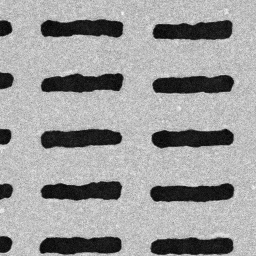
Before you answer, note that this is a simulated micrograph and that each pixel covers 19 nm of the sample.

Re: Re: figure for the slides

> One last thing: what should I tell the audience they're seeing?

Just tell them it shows a regular array of holes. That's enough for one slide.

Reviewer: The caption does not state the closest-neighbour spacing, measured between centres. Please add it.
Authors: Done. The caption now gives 1020 nm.